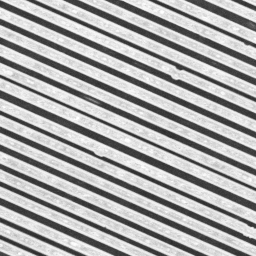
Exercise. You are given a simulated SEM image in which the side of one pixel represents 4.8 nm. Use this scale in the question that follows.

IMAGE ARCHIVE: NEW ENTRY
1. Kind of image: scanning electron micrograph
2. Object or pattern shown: parallel lines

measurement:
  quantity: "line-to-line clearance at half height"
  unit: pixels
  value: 7.54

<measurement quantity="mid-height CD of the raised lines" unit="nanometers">44.4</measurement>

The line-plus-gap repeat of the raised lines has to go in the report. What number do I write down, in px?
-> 16.4